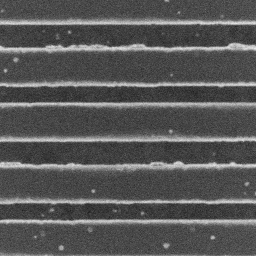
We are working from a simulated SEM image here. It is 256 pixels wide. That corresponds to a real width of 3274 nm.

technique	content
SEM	lines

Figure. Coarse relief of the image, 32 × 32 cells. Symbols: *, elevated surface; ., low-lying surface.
********************************
********************************
********************************
................................
................................
................................
********************************
********************************
********************************
********************************
********************************
................................
................................
********************************
********************************
********************************
********************************
***********..............*******
................................
................................
................................
********************************
********************************
********************************
********************************
................................
................................
................................
********************************
********************************
********************************
********************************